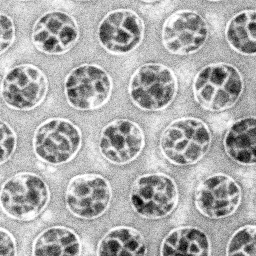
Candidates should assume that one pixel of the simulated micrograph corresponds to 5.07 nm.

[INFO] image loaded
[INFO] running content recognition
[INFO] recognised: a regular array of raised bodies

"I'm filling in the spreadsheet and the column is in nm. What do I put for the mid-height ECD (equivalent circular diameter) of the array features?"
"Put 230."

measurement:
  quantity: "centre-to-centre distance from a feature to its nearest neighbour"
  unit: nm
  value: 320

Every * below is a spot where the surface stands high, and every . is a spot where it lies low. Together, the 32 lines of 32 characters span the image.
................................
......**......**......**.......*
*....****....*****...****....***
**..******..******..******..****
**..******..******..******..****
*...*****....****....****....***
......**......**.....***......**
................................
..**.....****....****.....***...
.****...******...*****...*****..
******..******..******..******..
******..******..******..******..
.****...*****....****....*****..
..**.....***......**......**....
................................
*....****.....***....*****...***
**...*****...*****...*****..****
**..******..******..******..****
**..******..******..******..****
*....****....****....****....***
......................**......*.
................................
.****....****....****.....***...
******...*****..******...*****..
******..******..******..******..
******..******...*****...*****..
.****....****....****....****...
................................
.......*......**.......**.....**
*....*****...*****...*****...***
**..******..******..******...***
**..******..******..******..****